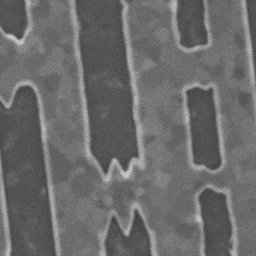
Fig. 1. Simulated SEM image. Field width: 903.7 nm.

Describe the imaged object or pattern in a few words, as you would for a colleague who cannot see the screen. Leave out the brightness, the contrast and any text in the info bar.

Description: one or a few lines or trenches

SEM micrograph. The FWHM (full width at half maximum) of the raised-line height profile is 175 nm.